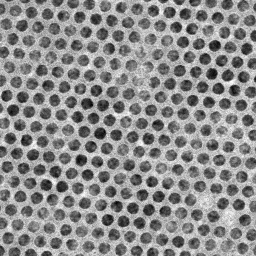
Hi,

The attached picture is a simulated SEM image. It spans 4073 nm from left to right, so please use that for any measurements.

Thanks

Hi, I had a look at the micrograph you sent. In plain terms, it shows a regular array of holes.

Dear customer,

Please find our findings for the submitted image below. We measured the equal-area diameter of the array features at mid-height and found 204 nm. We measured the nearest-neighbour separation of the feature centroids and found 254 nm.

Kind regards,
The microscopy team